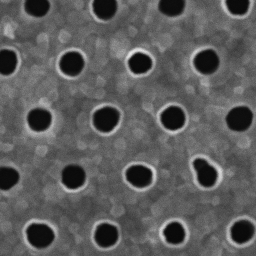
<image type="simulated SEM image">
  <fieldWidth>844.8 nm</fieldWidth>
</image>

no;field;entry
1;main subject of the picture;a regular array of holes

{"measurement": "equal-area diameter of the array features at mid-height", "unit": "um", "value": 0.0775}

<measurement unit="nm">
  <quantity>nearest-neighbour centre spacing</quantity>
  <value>216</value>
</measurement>